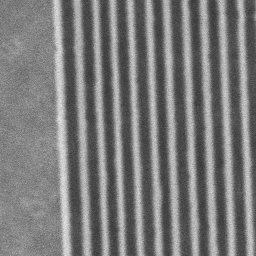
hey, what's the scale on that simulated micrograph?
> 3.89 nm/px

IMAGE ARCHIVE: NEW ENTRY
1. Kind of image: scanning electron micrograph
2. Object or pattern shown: parallel lines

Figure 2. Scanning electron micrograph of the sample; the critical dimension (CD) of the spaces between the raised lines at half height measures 0.0417 um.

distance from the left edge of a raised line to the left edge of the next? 0.0709 µm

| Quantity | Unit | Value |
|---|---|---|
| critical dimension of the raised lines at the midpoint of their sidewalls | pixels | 6.86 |